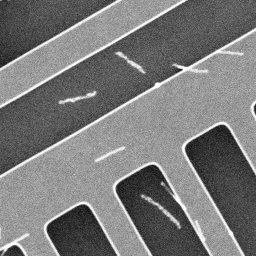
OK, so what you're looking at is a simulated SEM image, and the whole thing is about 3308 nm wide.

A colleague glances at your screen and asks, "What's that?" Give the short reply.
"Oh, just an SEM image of groups of lines, slits or small figures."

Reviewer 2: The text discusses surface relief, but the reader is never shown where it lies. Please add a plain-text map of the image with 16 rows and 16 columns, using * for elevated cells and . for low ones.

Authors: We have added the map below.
.......****.....
.....****.......
...****........*
.*****.......***
****.......*****
**.......*******
........********
......**********
....********...*
...*********...*
.********.**....
*******....**...
*******....**...
****..**....**..
***....**...**..
.**....**....**.